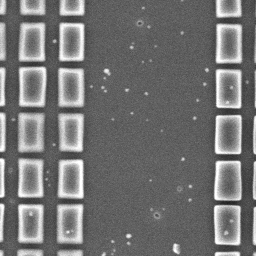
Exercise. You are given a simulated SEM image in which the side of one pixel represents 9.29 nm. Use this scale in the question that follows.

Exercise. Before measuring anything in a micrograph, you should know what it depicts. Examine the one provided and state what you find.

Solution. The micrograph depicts wiring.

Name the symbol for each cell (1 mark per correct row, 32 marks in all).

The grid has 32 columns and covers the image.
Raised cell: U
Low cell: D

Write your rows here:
DDDUUDDDUUDDDDDDDDDDDDDDDDDUUUDD
DDDUUDDDUUDDDDDDDDDDDDDDDDDUUUDD
DDDDDDDDDDDDDDDDDDDDDDDDDDDDDDDD
DDDUUDDDUUDDDDDDDDDDDDDDDDDUUUDD
DDDUUDDDUUDDDDDDDDDDDDDDDDDUUUDD
DDDUUDDDUUDDDDDDDDDDDDDDDDDUUUDD
DDDUUDDDUUDDDDDDDDDDDDDDDDDUUUDD
DDDDDDDDDDDDDDDDDDDDDDDDDDDUUUDD
DDDDDDDDDDDDDDDDDDDDDDDDDDDDDDDD
DDDUUUDDUUDDDDDDDDDDDDDDDDDUUUDD
DDDUUUDDUUDDDDDDDDDDDDDDDDDUUUDD
DDDUUDDDUUDDDDDDDDDDDDDDDDDUUUDD
DDDUUDDDUUDDDDDDDDDDDDDDDDDUUUDD
DDDDDDDDDDDDDDDDDDDDDDDDDDDDDDDD
DDDUUDDDDDDDDDDDDDDDDDDDDDDDDDDD
DDDUUDDDUUDDDDDDDDDDDDDDDDDUUUDD
DDDUUDDDUUDDDDDDDDDDDDDDDDDUUUDD
DDDUUDDDUUDDDDDDDDDDDDDDDDDUUUDD
DDDUUDDDUUDDDDDDDDDDDDDDDDDUUUDD
DDDDDDDDDDDDDDDDDDDDDDDDDDDDDDDD
DDDUUDDDUUDDDDDDDDDDDDDDDDDUUUDD
DDDUUDDDUUDDDDDDDDDDDDDDDDDUUUDD
DDDUUDDDUUDDDDDDDDDDDDDDDDDUUUDD
DDUUUDDDUUDDDDDDDDDDDDDDDDDUUUDD
DDDDDDDDUUDDDDDDDDDDDDDDDDDUUUDD
DDDDDDDDDDDDDDDDDDDDDDDDDDDDDDDD
DDUUUDDUUUDDDDDDDDDDDDDDDDDUUUDD
DDDUUDDUUUDDDDDDDDDDDDDDDDDUUUDD
DDDUUDDUUUDDDDDDDDDDDDDDDDDUUUDD
DDDUUDDUUUDDDDDDDDDDDDDDDDDUUUDD
DDDDDDDDDDDDDDDDDDDDDDDDDDDDUUDD
DDDUUDDDDDDDDDDDDDDDDDDDDDDDDDDD